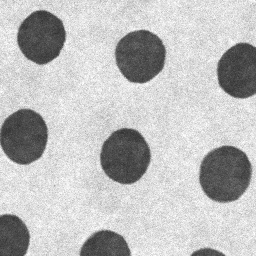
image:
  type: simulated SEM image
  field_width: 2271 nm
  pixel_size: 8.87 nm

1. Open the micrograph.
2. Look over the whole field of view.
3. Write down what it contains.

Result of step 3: holes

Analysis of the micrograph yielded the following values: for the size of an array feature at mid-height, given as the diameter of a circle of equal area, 466 nm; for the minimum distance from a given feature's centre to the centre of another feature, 894 nm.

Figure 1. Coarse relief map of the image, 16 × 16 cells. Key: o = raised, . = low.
oooooooooooooooo
o...oooooooooooo
o...oooo..oooooo
oo..ooo...oooo..
oooooooo..oooo..
oooooooooooooo..
oooooooooooooooo
...ooooooooooooo
...oooo..ooooooo
...ooo...oooo..o
oooooo...oooo...
ooooooooooooo...
ooooooooooooo..o
.ooooooooooooooo
..oooo.ooooooooo
..ooo...oooooooo